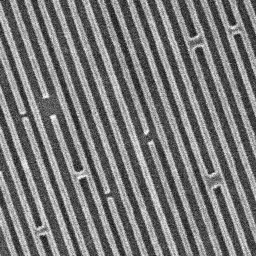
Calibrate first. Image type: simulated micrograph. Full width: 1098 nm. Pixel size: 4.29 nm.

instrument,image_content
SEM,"parallel lines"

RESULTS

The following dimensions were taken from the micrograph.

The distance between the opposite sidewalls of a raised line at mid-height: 22.8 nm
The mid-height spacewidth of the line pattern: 0.038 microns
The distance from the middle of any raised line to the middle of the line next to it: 59.4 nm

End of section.